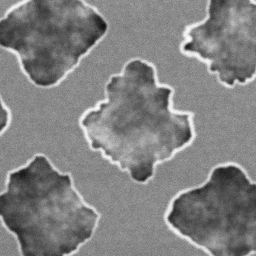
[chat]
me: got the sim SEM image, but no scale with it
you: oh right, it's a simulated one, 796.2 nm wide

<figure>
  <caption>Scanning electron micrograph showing holes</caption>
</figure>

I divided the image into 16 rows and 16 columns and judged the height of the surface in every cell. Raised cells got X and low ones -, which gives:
X-----XXXXXXX---
-------XXXXX----
------XXXXXX----
X----XXXXXXX----
XX--XXXX--XXX---
XXXXXXX---XXXXXX
XXXXXX-----XXXXX
XXXXX-------XXXX
XXXXX-------XXXX
XXXXXX-----XXXXX
X--XXXXX--XXXX-X
----XXXXXXXXX---
-----XXXXXX-----
------XXXXX-----
X-----XXXXX-----
X----XXXXXXXX---